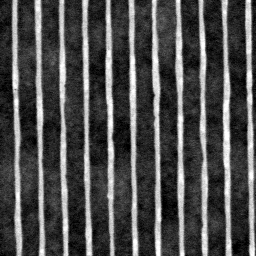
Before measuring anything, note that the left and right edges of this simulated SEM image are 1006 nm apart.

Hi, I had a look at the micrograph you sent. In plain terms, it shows parallel lines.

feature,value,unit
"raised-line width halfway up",4.63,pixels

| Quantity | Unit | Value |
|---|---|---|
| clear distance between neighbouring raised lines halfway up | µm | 0.0728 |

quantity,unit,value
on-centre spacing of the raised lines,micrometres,0.0919